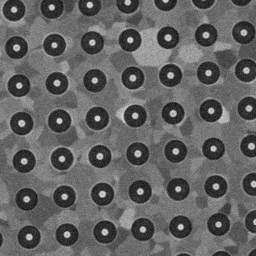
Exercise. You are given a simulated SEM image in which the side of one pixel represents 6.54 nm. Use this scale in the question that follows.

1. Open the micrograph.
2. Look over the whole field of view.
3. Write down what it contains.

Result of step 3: an array of small figures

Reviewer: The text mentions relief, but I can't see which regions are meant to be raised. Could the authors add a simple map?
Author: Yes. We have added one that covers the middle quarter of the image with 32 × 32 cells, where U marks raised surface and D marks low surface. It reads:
UUUUUUUUUUUUUUUUUDUUUUUUUDDDDUUU
UUUUUUDDDUUUUUUDDDDUUUUUDDDDDUUU
UUUUUDDDDDUUUUDDDDDDUUUDDDUDDDUU
DUUUUDDUDDDUUUDDDUDDUUUUDDUDDDUU
DUUUUDDUDDDUUUDDDDDDUUUUDDDDDUUU
DUUUUDDDDDUUUUUDDDDUUUUUUDDDUUUU
DUUUUUDDDDUUUUUUUDUUUUUUUUUUUUUU
UUUUUUUUUUUUUUUUUUUUUUUUUUUUUUUU
UUUUUUUUUUUUUUUUUUUUUUUUUUUUUUUU
UUUUUUUUUUUUUUUUUUUUUUUUUUUDUUUU
UUUUUUUUUUUUUUUUDDDUUUUUUDDDDDUU
UUUUUUDDDDDUUUUDDDDDUUUUDDDDDDUU
DUUUUUDDDDDUUUUDDUDDDUUUDDDUDDUU
DDUUUDDDUDDDUUUDDDDDDUUUUDDDDDUU
DDUUUDDDDDDUUUUDDDDDUUUUUDDDDUUU
DDUUUUDDDDDUUUUUDDDUUUUUUUUUUUUU
DUUUUUUDDDUUUUUUUUUUUUUUUUUUUUUU
UUUUUUUUUUUUUUUUUUUUUUUUUUUUUUUU
UUUUUUUUUUUUUUUUUUUUUUUUUUUUUUUU
UUUUUUUUUUUUUUUUUUDUUUUUUUDDDDUU
UUUUUUUDDDUUUUUUDDDDDUUUUDDDDDDU
DDUUUUDDDDDDUUUUDDDDDUUUUDDUDDDU
DDUUUUDDDDDDUUUDDDUDDUUUUDDDDDDU
DDDUUUDDUUDDUUUUDDDDDUUUUDDDDDUU
DDDUUUDDDDDDUUUUDDDDDUUUUUUDDUUU
DDUUUUUDDDDUUUUUUUUUUUUUUUUUUUUU
DUUUUUUUUUUUUUUUUUUUUUUUUUUUUUUU
UUUUUUUUUUUUUUUUUUUUUUUUUUUUUUUU
UUUUUUUUUUUUUUUUUUUUUUUUUUUUDDUU
UUUUUUUUUDUUUUUUUDDDDUUUUUDDDDDU
DDUUUUUDDDDDUUUUDDDDDDUUUUDDDDDU
DDDUUUUDDDDDDUUUDDDUDDUUUDDDUDDD